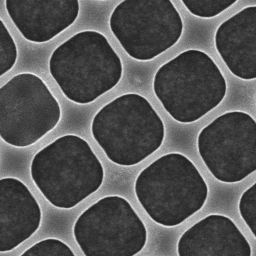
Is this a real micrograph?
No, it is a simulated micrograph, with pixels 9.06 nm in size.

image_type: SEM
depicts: holes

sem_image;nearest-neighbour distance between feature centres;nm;672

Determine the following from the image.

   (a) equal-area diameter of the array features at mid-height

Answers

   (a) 0.627 um